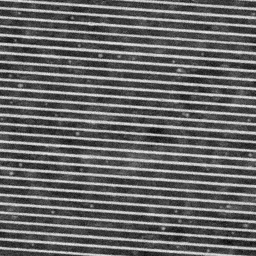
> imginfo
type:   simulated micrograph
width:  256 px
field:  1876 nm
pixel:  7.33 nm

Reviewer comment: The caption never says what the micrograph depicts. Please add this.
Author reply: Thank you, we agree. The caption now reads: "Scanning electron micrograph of parallel lines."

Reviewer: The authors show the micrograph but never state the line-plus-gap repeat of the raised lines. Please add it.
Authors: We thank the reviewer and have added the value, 64.9 nanometers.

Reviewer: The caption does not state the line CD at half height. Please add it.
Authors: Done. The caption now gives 14.6 nanometers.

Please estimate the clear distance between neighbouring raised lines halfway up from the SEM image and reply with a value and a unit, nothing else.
0.053 microns